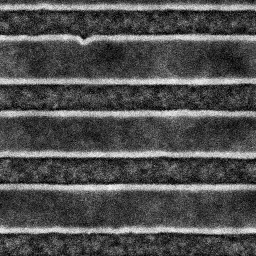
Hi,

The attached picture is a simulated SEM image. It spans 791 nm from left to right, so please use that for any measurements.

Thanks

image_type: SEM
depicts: one or a few lines or trenches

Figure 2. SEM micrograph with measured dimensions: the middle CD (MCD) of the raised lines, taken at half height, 135 nanometers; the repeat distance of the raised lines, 0.23 microns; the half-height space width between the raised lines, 0.096 µm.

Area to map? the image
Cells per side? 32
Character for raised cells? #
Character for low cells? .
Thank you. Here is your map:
################################
................................
................................
................................
................................
################################
################################
################################
################################
################################
................................
................................
................................
................................
################################
################################
################################
################################
################################
................................
................................
................................
................................
################################
################################
################################
################################
################################
################################
................................
................................
................................